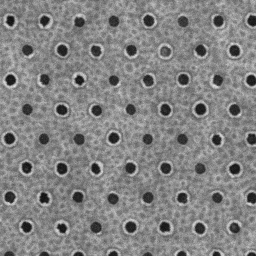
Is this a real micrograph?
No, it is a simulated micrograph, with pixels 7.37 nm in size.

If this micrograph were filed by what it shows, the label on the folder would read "a regular array of holes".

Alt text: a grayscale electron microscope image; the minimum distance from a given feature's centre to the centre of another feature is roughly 0.248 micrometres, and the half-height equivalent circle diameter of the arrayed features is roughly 0.0819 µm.